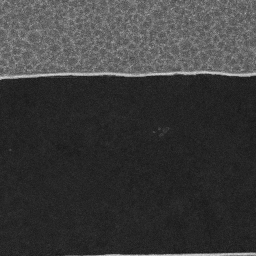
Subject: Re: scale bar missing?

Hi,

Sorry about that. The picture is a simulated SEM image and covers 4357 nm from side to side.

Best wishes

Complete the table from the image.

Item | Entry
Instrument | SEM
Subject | one or a few lines or trenches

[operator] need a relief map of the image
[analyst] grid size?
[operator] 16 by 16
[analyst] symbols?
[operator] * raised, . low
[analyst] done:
****************
****************
****************
****************
************.***
................
................
................
................
................
................
................
................
................
................
................